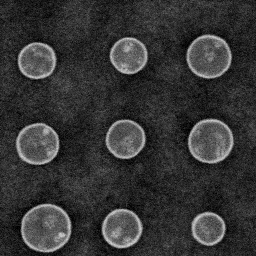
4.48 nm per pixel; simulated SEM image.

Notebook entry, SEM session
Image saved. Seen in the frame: a regular array of raised bodies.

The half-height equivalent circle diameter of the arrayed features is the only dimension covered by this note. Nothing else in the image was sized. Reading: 0.176 um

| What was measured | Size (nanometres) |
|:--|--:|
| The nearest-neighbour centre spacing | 372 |